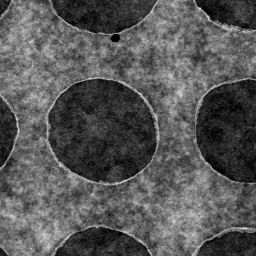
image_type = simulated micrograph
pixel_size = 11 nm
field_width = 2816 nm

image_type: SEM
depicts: raised bodies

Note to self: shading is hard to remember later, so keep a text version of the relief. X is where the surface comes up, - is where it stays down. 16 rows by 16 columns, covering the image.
X--XXXXXXX--XXXX
----XXXXX-----XX
----------------
----------------
----------------
----XXXX-----XXX
X--XXXXXX---XXXX
X--XXXXXXX--XXXX
X--XXXXXXX--XXXX
X--XXXXXXX--XXXX
----XXXXX----XXX
------X---------
----------------
----------------
-----XXX------XX
----XXXXX---XXXX